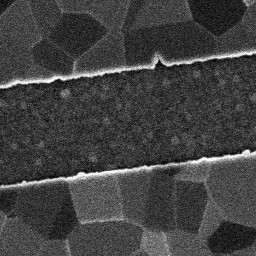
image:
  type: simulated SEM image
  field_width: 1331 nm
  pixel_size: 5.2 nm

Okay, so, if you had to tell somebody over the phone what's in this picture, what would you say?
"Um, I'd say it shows one or a few lines or trenches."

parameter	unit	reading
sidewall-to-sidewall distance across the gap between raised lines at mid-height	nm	509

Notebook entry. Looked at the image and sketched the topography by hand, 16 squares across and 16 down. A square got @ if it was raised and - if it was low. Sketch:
@@@@@@@@@@@@@@@@
@@@@@@@@@@@@@@@@
@@@@@@@@@@@@@@@@
@@@@@@@@@@@@@@@-
@@@@@@@---------
----------------
----------------
----------------
----------------
----------------
---------@@@@@@@
-@@@@@@@@@@@@@@@
@@@@@@@@@@@@@@@@
@@@@@@@@@@@@@@@@
@@@@@@@@@@@@@@@@
@@@@@@@@@@@@@@@@